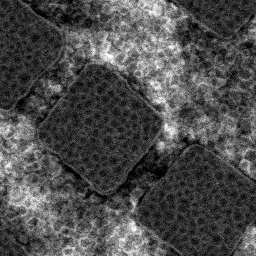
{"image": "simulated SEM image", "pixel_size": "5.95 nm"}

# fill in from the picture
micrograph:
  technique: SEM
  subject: raised bodies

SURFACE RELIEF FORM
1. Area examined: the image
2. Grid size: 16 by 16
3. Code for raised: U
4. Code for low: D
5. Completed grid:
UUDDDDDDDDDUUUUU
UUUDDDDDDDDDDUUD
UUUUDDDDDDDDDDDD
UUUUDDDDDDDDDDDD
UUUDDUUDDDDDDDDD
UUDDUUUUDDDDDDDD
UDDDUUUUUDDDDDDD
DDDUUUUUUUDDDDDD
DDUUUUUUUUDDDDDD
DDDUUUUUUDDUUDDD
DDDDUUUUDDDUUUUD
DDDDDDUUDDUUUUUU
DDDDDDDDDUUUUUUU
DDDDDDDDDUUUUUUU
DDDDDDDDDUUUUUUD
UDDDDDDDDDDUUUUD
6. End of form